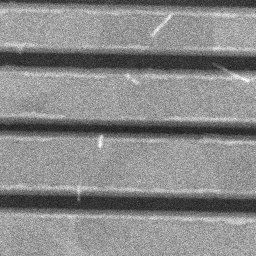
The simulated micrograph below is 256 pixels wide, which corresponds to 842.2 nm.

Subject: one or a few lines or trenches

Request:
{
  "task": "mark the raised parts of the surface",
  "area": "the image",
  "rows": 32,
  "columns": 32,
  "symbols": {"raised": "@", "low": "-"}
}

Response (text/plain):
--------------------------------
@@@@@@@@@@@@@@@@@@@@@@@@@@@@@---
@@@@@@@@@@@@@@@@@@@@@@@@@@@@@@@@
@@@@@@@@@@@@@@@@@@@@@@@@@@@@@@@@
@@@@@@@@@@@@@@@@@@@@@@@@@@@@@@@@
@@@@@@@@@@@@@@@@@@@@@@@@@@@@@@@@
----------------------------@@@@
--------------------------------
--------------------------------
@@@@@@@@@@@@@@@@@@@@@@@@@@@@@@@@
@@@@@@@@@@@@@@@@@@@@@@@@@@@@@@@@
@@@@@@@@@@@@@@@@@@@@@@@@@@@@@@@@
@@@@@@@@@@@@@@@@@@@@@@@@@@@@@@@@
@@@@@@@@@@@@@@@@@@@@@@@@@@@@@@@@
@@@@@@@@@@@@@@@@@@@@@@@@@@@@@@@@
--------------------------------
--------------------------------
@@@@@@@@@@@@@@@@@@@@@@@@@@@@@@@@
@@@@@@@@@@@@@@@@@@@@@@@@@@@@@@@@
@@@@@@@@@@@@@@@@@@@@@@@@@@@@@@@@
@@@@@@@@@@@@@@@@@@@@@@@@@@@@@@@@
@@@@@@@@@@@@@@@@@@@@@@@@@@@@@@@@
@@@@@@@@@@@@@@@@@@@@@@@@@@@@@@@@
@@@@@@@@@@@@@@@@@@@@@@@@@@@@@@@@
--------------------------------
--------------------------------
@-------------------------------
@@@@@@@@@@@@@@@@@@@@@@@@@@@@@@@@
@@@@@@@@@@@@@@@@@@@@@@@@@@@@@@@@
@@@@@@@@@@@@@@@@@@@@@@@@@@@@@@@@
@@@@@@@@@@@@@@@@@@@@@@@@@@@@@@@@
@@@@@@@@@@@@@@@@@@@@@@@@@@@@@@@@